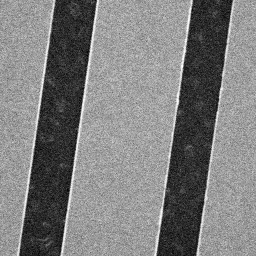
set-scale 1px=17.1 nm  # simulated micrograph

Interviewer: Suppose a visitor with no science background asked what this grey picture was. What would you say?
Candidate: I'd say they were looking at one or a few lines or trenches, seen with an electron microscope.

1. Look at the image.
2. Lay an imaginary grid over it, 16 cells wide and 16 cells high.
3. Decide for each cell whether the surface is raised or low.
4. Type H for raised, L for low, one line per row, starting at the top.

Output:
HHHLLLHHHHHHLLLH
HHHLLLHHHHHHLLHH
HHHLLLHHHHHHLLHH
HHHLLLHHHHHHLLHH
HHHLLHHHHHHLLLHH
HHHLLHHHHHHLLLHH
HHLLLHHHHHHLLLHH
HHLLLHHHHHHLLLHH
HHLLLHHHHHHLLHHH
HHLLLHHHHHHLLHHH
HHLLLHHHHHLLLHHH
HHLLHHHHHHLLLHHH
HHLLHHHHHHLLLHHH
HLLLHHHHHHLLLHHH
HLLLHHHHHHLLLHHH
HLLLHHHHHHLLHHHH